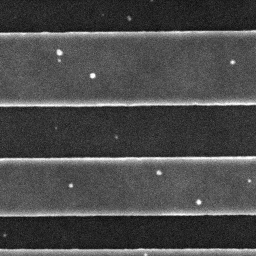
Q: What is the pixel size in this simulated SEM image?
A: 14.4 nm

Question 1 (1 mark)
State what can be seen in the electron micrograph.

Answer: lines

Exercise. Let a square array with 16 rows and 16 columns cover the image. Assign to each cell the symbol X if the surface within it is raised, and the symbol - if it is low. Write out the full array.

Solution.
----------------
----------------
XXXXXXXXXXXXXXXX
XXXXXXXXXXXXXXXX
XXXXXXXXXXXXXXXX
XXXXXXXXXXXXXXXX
XXXXXXXXX-------
----------------
----------------
----------------
XXXXXXXXXXXXXXXX
XXXXXXXXXXXXXXXX
XXXXXXXXXXXXXXXX
----------------
----------------
----------------